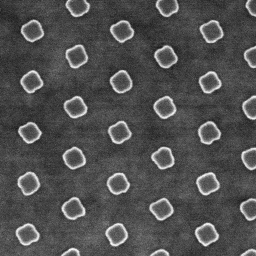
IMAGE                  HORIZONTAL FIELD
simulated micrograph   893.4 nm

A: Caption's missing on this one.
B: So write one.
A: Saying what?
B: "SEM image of a regular array of raised bodies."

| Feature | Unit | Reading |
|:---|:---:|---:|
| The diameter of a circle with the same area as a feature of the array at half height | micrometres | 0.0727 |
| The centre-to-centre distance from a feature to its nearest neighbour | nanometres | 177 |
